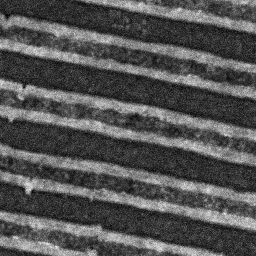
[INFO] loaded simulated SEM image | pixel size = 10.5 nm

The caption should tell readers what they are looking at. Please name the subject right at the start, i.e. one or a few lines or trenches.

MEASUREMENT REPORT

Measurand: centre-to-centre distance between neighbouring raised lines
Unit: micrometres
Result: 0.673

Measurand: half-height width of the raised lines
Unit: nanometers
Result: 258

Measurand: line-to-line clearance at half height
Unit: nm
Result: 414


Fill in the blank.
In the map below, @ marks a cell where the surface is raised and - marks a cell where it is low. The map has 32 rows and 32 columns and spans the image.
----------------@@@@@@@@@@@@@@@@
---------------------@@@@@@@@@@@
---------------------------@@@@@
@@@@@@--------------------------
@@@@@@@@@@@---------------------
@@@@@@@@@@@@@@@@----------------
-----@@@@@@@@@@@@@@@@-----------
-----------@@@@@@@@@@@@@@@@-----
----------------@@@@@@@@@@@@@@@-
---------------------@@@@@@@@@@@
--------------------------@@@@@@
@@@@@-------------------------@@
@@@@@@@@@@@---------------------
@@@@@@@@@@@@@@@@----------------
----@@@@@@@@@@@@@@@@@-----------
----------@@@@@@@@@@@@@@@-------
---------------@@@@@@@@@@@@@@---
--------------------@@@@@@@@@@@@
-------------------------@@@@@@@
@@@--------------------------@@@
@@@@@@@@------------------------
@@@@@@@@@@@@@@@-----------------
---@@@@@@@@@@@@@@@@@------------
--------@@@@@@@@@@@@@@@@@-------
--------------@@@@@@@@@@@@@@@---
-------------------@@@@@@@@@@@@@
------------------------@@@@@@@@
@@@-------------------------@@@@
@@@@@@@@------------------------
@@@@@@@@@@@@@-------------------
--@@@@@@@@@@@@@@@@@-------------
--------@@@@@@@@@@@@@@@@--------